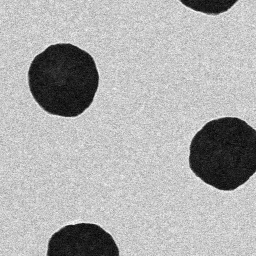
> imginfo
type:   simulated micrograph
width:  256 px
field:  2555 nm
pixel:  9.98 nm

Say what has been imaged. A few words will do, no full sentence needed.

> holes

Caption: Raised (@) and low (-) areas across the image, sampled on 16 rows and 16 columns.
@@@@@@@@@@@@--@@
@@@@@@@@@@@@@@@@
@@@@@@@@@@@@@@@@
@@----@@@@@@@@@@
@@----@@@@@@@@@@
@@----@@@@@@@@@@
@@----@@@@@@@@@@
@@@@@@@@@@@@@--@
@@@@@@@@@@@@----
@@@@@@@@@@@@----
@@@@@@@@@@@@----
@@@@@@@@@@@@@--@
@@@@@@@@@@@@@@@@
@@@@@@@@@@@@@@@@
@@@@---@@@@@@@@@
@@@----@@@@@@@@@